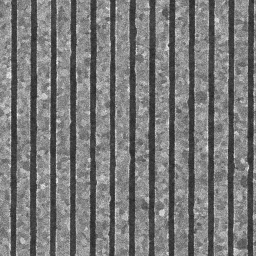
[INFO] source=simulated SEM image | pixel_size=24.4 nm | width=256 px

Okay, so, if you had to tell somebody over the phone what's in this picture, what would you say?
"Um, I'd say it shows parallel lines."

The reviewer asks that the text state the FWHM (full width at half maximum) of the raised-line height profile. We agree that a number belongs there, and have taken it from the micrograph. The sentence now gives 0.327 um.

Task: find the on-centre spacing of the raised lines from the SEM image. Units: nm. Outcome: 483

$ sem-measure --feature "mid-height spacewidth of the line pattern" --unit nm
156